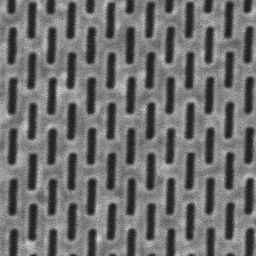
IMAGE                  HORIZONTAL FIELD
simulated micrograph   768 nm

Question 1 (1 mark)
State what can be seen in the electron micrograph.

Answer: a regular array of holes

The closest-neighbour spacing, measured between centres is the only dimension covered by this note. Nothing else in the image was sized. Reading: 0.0951 µm